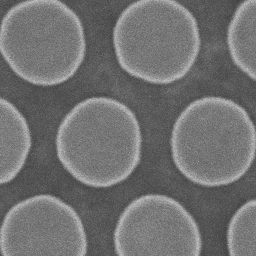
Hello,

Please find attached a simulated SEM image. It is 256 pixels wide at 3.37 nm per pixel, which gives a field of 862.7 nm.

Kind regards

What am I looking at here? raised bodies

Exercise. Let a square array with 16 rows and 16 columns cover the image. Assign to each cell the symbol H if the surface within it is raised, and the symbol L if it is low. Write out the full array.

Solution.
LHHHLLLLHHHLLLLH
HHHHHLLHHHHHLLHH
HHHHHLLHHHHHLLHH
HHHHHLLHHHHHLLLH
LHHHHLLLHHHHLLLH
LLLLLLLLLLLLLLLL
HLLLLHHHLLLLHHHL
HLLLHHHHLLLHHHHH
HHLLHHHHHLLHHHHH
HHLLHHHHHLLHHHHH
HLLLHHHHLLLHHHHL
LLLLLHHLLLLLLHLL
LLHHLLLLLHHLLLLL
HHHHHLLLHHHHLLLH
HHHHHLLHHHHHLLHH
HHHHHLLHHHHHHLHH